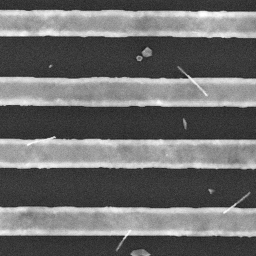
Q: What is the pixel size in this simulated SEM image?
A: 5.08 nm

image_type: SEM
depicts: lines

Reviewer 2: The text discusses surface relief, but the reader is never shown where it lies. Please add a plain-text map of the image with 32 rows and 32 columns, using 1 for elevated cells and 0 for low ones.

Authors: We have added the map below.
00000000000000000000000000000000
11111111111111110001100000000000
11111111111111111111111111111111
11111111111111111111111111111111
00000000000001110000011011111111
00000000000000000000000000000000
00000000000000000000000000000000
00000000000000000000000000000000
00000000000000000000000000000000
00000000000000000000000000000000
11111111111111111111111111111111
11111111111111111111111111111111
11111111111111111111111111111111
00000000000000000000000000000000
00000000000000000000000000000000
00000000000000000000000000000000
00000000000000000000000000000000
11000111000000000000000000000000
11111111111111111111111111111111
11111111111111111111111111111111
11111111111111111111111111111111
00000000000000000000000000000000
00000000000000000000000000000000
00000000000000000000000000000000
00000000000000000000000000000000
00000000000000000000000000000000
11111111111111111111111111111111
11111111111111111111111111111111
11111111111111111111111111111111
00000000000000000000000000000000
00000000000000000000000000000000
00000000000000000000000000000000